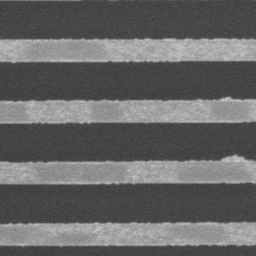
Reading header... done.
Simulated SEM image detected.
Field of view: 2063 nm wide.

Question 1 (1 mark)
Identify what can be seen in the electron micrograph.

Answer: lines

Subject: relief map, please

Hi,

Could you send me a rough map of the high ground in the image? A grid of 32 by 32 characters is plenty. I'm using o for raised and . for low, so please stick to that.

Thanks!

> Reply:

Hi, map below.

................................
................................
................................
................................
................................
oooooooooooooooooooooooooooooooo
oooooooooooooooooooooooooooooooo
oooooooooooooooooooooooooooooooo
................................
................................
................................
................................
................................
oooooooooooooooooooooooooooooooo
oooooooooooooooooooooooooooooooo
................................
................................
................................
................................
................................
oooooooooooooooooooooooooooooooo
oooooooooooooooooooooooooooooooo
oooooooooooooooooooooooooooooooo
................................
................................
................................
................................
................................
oooooooooooooooooooooooooooooooo
oooooooooooooooooooooooooooooooo
oooooooooooooooooooooooooooooooo
................................